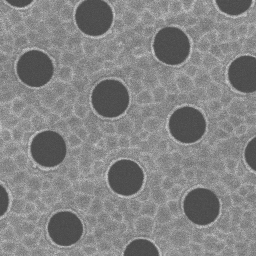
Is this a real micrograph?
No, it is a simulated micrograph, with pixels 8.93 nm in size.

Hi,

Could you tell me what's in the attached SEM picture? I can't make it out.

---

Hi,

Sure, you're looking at a regular array of holes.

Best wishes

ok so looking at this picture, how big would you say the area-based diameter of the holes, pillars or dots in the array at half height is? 0.324 µm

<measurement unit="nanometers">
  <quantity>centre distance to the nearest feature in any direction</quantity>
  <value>716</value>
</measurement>